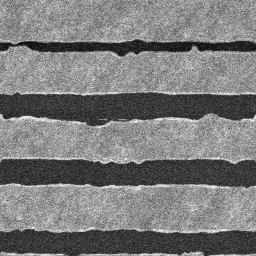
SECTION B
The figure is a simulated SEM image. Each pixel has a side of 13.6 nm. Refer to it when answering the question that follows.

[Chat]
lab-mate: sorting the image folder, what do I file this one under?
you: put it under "one or a few lines or trenches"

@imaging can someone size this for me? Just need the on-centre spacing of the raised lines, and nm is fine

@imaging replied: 923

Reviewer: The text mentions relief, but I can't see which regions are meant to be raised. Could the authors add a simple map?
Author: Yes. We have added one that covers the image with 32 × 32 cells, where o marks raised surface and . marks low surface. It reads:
oooooooooooooooooooooooooooooooo
oooooooooooooooooooooooooooooooo
oooooooooooooooooooooooooooooooo
oooooooooooooooooooooooooooooooo
oooooooooooooooooooooooooooooooo
................................
ooooo...................o.......
oooooooooooooooooooooooooooooooo
oooooooooooooooooooooooooooooooo
oooooooooooooooooooooooooooooooo
oooooooooooooooooooooooooooooooo
ooooooooooooooooo...oooooooooooo
................................
................................
..........................o.....
ooooooooooo..ooooooooooooooooooo
oooooooooooooooooooooooooooooooo
oooooooooooooooooooooooooooooooo
oooooooooooooooooooooooooooooooo
oooooooooooooooooooooooooooooooo
................................
................................
................................
oooooooooooooooooooooooooooooooo
oooooooooooooooooooooooooooooooo
oooooooooooooooooooooooooooooooo
oooooooooooooooooooooooooooooooo
oooooooooooooooooooooooooooooooo
oooooooooooooooooooooooooooooooo
................................
................................
................................